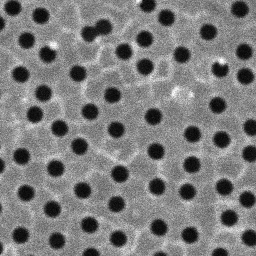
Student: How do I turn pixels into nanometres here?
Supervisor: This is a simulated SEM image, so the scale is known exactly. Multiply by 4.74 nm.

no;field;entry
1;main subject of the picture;a regular array of holes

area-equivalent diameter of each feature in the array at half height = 83.2 nanometres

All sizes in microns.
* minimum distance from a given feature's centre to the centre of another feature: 0.145